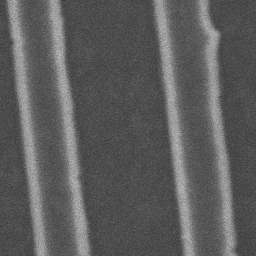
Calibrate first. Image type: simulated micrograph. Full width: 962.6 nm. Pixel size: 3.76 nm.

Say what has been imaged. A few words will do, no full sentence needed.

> one or a few lines or trenches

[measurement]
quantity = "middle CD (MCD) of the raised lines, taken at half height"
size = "167 nm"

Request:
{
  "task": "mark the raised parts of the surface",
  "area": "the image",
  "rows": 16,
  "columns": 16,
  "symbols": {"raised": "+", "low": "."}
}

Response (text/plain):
.++.......+++...
.+++......+++...
.+++......+++...
.+++......+++...
.+++......+++...
.+++.......++...
.+++.......++...
..++.......+++..
..++.......+++..
..+++......+++..
..+++......+++..
..+++......+++..
..+++......+++..
..+++.......++..
..+++.......++..
..+++.......++..